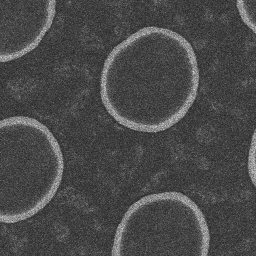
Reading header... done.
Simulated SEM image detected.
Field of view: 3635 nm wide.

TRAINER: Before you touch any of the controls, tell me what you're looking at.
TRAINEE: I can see raised bodies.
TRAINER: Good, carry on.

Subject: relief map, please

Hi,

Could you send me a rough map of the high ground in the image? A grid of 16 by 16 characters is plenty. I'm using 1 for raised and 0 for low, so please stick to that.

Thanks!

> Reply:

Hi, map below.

1110000000000001
1110000000000000
1100000011100000
1000000111110000
0000000111110000
0000001111110000
0000000111110000
0000000011100000
1110000000000000
1111000000000000
1111000000000000
1111000000000000
1110000001110000
1000000011110000
0000000111111000
0000000111111000